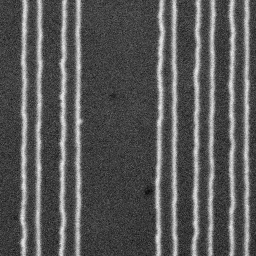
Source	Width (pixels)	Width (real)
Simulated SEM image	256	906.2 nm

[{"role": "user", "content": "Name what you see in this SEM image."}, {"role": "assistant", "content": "lines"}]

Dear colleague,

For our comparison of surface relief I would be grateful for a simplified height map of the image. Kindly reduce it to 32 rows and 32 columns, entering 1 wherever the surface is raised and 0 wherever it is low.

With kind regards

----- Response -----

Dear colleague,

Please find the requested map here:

00011000110000000000110001100110
00011000110000000000110001100110
00011000110000000000110001100110
00011000110000000000110001100110
00011000110000000000110001100110
00011000110000000000110001100110
00011000110000000000110001100110
00011000110000000000110001100110
00011000110000000000110001100110
00011000110000000000110011100110
00011000110000000000110011100110
00011000110000000000110001100110
00011000110000000000110001100110
00011000110000000000110001100110
00011000110000000000110011100110
00011000110000000000110011000110
00011000110000000000110011000110
00011000110000000000110011100110
00011000110000000000110011000110
00011000110000000000110011000110
00011000110000000000110011100110
00011000110000000000110011100110
00011000110000000000110011100110
00011000110000000000110011000110
00011000110000000000110011000110
00011000110000000000110011000110
00011000110000000000110011000110
00011000110000000000110011000110
00011000110000000000110011000110
00011000110000000000110011000110
00011000110000000000110011000110
00011000110000000000110011000110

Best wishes